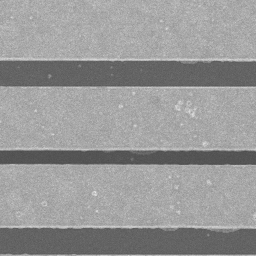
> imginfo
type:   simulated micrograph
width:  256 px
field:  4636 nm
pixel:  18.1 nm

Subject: lines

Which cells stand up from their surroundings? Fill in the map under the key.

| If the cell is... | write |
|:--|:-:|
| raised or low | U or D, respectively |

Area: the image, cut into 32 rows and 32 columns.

UUUUUUUUUUUUUUUUUUUUUUUUUUUUUUUU
UUUUUUUUUUUUUUUUUUUUUUUUUUUUUUUU
UUUUUUUUUUUUUUUUUUUUUUUUUUUUUUUU
UUUUUUUUUUUUUUUUUUUUUUUUUUUUUUUU
UUUUUUUUUUUUUUUUUUUUUUUUUUUUUUUU
UUUUUUUUUUUUUUUUUUUUUUUUUUUUUUUU
UUUUUUUUUUUUUUUUUUUUUUUUUUUUUUUU
UUUUUUUUUUUUUUUUUUUUUUUUUUUUUUUU
DDDDDDDDDDDDDDDDDDDDDDDDDDDDDDDD
DDDDDDDDDDDDDDDDDDDDDDDDDDDDDDDD
DDDDDDDDDDDDDDDDDDDDDDDDDDDDDDDD
UUUUUUUUUUUUUUUUUUUUUUUUUUUUUUUU
UUUUUUUUUUUUUUUUUUUUUUUUUUUUUUUU
UUUUUUUUUUUUUUUUUUUUUUUUUUUUUUUU
UUUUUUUUUUUUUUUUUUUUUUUUUUUUUUUU
UUUUUUUUUUUUUUUUUUUUUUUUUUUUUUUU
UUUUUUUUUUUUUUUUUUUUUUUUUUUUUUUU
UUUUUUUUUUUUUUUUUUUUUUUUUUUUUUUU
UUUUUUUUUUUUUUUUUUUUUUUUUUUUUUUU
DDDDDDDDDDDDDDDDDDDDDDDDDDDDDDDD
DDDDDDDDDDDDDDDDDDDDDDDDDDDDDDDD
UUUUUUUUUUUUUUUUUUUUUUUUUUUUUUUU
UUUUUUUUUUUUUUUUUUUUUUUUUUUUUUUU
UUUUUUUUUUUUUUUUUUUUUUUUUUUUUUUU
UUUUUUUUUUUUUUUUUUUUUUUUUUUUUUUU
UUUUUUUUUUUUUUUUUUUUUUUUUUUUUUUU
UUUUUUUUUUUUUUUUUUUUUUUUUUUUUUUU
UUUUUUUUUUUUUUUUUUUUUUUUUUUUUUUU
DDDDDDDUUUDDDDDDUDDDDDDDDUUUUUUU
DDDDDDDDDDDDDDDDDDDDDDDDDDDDDDDD
DDDDDDDDDDDDDDDDDDDDDDDDDDDDDDDD
DDDDDDDDDDDDDDDDDDDDDDDDDDDDDDDD